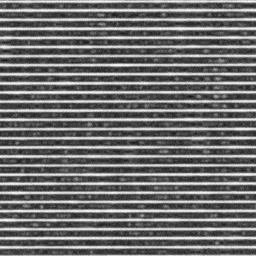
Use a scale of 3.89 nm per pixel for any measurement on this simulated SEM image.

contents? parallel lines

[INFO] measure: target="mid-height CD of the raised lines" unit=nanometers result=6.3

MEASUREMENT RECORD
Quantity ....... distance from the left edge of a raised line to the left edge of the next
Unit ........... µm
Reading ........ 0.0355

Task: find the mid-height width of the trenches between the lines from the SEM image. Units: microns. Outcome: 0.0282